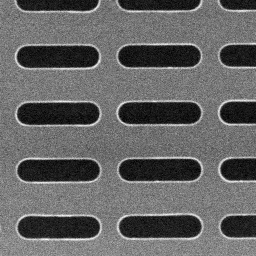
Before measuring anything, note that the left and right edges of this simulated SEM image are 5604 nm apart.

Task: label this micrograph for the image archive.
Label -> groups of lines, slits or small figures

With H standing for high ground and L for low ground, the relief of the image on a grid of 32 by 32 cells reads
HHLLLLLLLLLLHHHLLLLLLLLLLHHHLLLL
HHHHLLLLLLLHHHHHHHHHHLHHHHHHHHHH
HHHHHHHHHHHHHHHHHHHHHHHHHHHHHHHH
HHHHHHHHHHHHHHHHHHHHHHHHHHHHHHHH
HHHHHHHHHHHHHHHHHHHHHHHHHHHHHHHH
HHHHHHHHHHHHHHHHHHHLLLLLHHHHHLLL
HHLLLLLLLLLLHHHLLLLLLLLLLHHLLLLL
HHLLLLLLLLLLHHHLLLLLLLLLLHHLLLLL
HHHLLLLLLLLHHHHHLLLLLLLHHHHHHHHH
HHHHHHHHHHHHHHHHHHHHHHHHHHHHHHHH
HHHHHHHHHHHHHHHHHHHHHHHHHHHHHHHH
HHHHHHHHHHHHHHHHHHHHHHHHHHHHHHHH
HHHHHHHHHHHHHHHHHHHHHHHHHHHHHHHH
HHLLLLLLLLLLHHHLLLLLLLLLLHHHLLLL
HHLLLLLLLLLLHHHLLLLLLLLLLHHLLLLL
HHHLLLLLLLLLHHHHLLLLLLLLHHHHHLLL
HHHHHHHHHHHHHHHHHHHHHHHHHHHHHHHH
HHHHHHHHHHHHHHHHHHHHHHHHHHHHHHHH
HHHHHHHHHHHHHHHHHHHHHHHHHHHHHHHH
HHHHHHHHHHHHHHHHHHHHHHHHHHHHHHHH
HHLLLLLLLLLLHHHLLLLLLLLLLHHHLLLL
HHLLLLLLLLLLLHHLLLLLLLLLLHHLLLLL
HHHLLLLLLLLLHHHHLLLLLLLLHHHHLLLL
HHHHHHHHHHHHHHHHHHHHHHHHHHHHHHHH
HHHHHHHHHHHHHHHHHHHHHHHHHHHHHHHH
HHHHHHHHHHHHHHHHHHHHHHHHHHHHHHHH
HHHHHHHHHHHHHHHHHHHHHHHHHHHHHHHH
HHHLLLLLLLLLHHHLLLLLLLLLLHHHLLLL
HHLLLLLLLLLLLHHLLLLLLLLLLHHHLLLL
HHHLLLLLLLLLHHHLLLLLLLLLLHHHLLLL
HHHHHHHHHHHHHHHHHHHHHHHHHHHHHHHH
HHHHHHHHHHHHHHHHHHHHHHHHHHHHHHHH